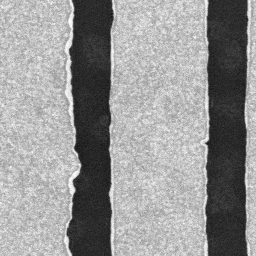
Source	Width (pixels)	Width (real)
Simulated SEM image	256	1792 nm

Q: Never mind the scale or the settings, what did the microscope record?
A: one or a few lines or trenches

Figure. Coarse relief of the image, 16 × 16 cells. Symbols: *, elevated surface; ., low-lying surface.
*****..******...
*****..******...
****...******...
****...******...
****...******...
****...******..*
****...******..*
*****..******..*
*****..******..*
*****..******..*
*****..******..*
*****..******..*
****...******..*
****...******..*
****...******..*
****...******...